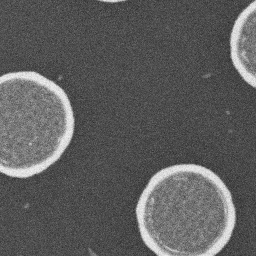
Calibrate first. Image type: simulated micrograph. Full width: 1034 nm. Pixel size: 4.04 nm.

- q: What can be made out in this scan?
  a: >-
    raised bodies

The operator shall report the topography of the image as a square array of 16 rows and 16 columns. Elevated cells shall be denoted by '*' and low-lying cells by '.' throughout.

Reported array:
................
...............*
...............*
...............*
...............*
***.............
****............
****............
****............
****............
**.........*....
.........*****..
.........*****..
.........*****..
.........*****..
..........****..